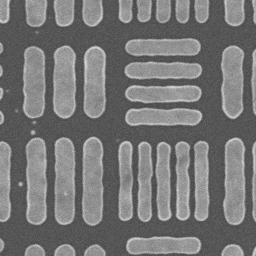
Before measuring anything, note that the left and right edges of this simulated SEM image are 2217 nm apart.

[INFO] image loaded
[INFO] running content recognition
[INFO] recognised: groups of lines, slits or small figures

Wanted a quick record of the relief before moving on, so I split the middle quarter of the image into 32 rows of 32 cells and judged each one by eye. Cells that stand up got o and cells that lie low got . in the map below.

oo...ooooo......oooooooooooooooo
ooo..ooooo.....ooooooooooooooooo
ooo..ooooo......oooooooooooooooo
ooo..ooooo........oo............
ooo..ooooo......................
ooo..ooooo......................
ooo..ooooo......oooooooooooooooo
ooo..ooooo......oooooooooooooooo
ooo..ooooo......oooooooooooooooo
ooo..ooooo..........ooo.o.......
ooo..ooooo......................
ooo..ooooo.........oooo....oooo.
oo....ooo.......oooooooooooooooo
................oooooooooooooooo
................oooooooooooooooo
................................
................................
................................
................................
oo...oooo.......................
oo...oooo.....ooo..oo...oo..ooo.
ooo..ooooo....ooo..ooo..oo..ooo.
ooo..ooooo....ooo..ooo..oo..ooo.
ooo..oooo.....ooo..ooo..oo..ooo.
ooo..oooo.....ooo..ooo.ooo..ooo.
ooo..ooooo....ooo..ooo.ooo..ooo.
ooo..ooooo....ooo..ooo.ooo..ooo.
ooo..ooooo....ooo..ooo.ooo..ooo.
ooo..oooo.....ooo..ooo.ooo..ooo.
oo...oooo.....ooo..ooo..oo..ooo.
ooo..ooooo....ooo..ooo..oo..ooo.
ooo..ooooo....ooo..ooo..oo..ooo.